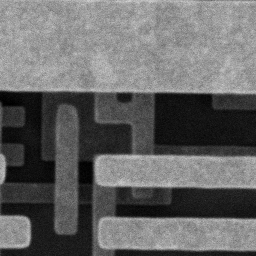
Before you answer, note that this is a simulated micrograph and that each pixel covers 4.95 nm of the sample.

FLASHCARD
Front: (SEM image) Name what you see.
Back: wiring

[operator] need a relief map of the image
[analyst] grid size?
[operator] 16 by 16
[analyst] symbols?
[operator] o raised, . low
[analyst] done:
oooooooooooooooo
oooooooooooooooo
oooooooooooooooo
oooooooooooooooo
oooooooooooooooo
oooooooooooooooo
................
................
................
................
......oooooooooo
......oooooooooo
................
................
oo....oooooooooo
.......ooooooooo